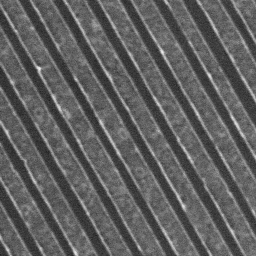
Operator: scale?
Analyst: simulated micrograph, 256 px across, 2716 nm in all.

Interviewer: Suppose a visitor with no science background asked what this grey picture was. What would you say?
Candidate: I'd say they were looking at parallel lines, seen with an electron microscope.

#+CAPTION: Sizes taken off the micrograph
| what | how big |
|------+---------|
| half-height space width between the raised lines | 172 nanometres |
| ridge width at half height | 12.5 px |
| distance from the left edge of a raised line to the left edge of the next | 0.306 micrometres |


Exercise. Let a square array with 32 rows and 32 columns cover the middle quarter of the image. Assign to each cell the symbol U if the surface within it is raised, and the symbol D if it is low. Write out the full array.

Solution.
UDDDDDUUUUDDDDDUUUDDDDDUUUUDDDDU
UUDDDDDUUUDDDDDUUUUDDDDUUUUDDDDD
UUDDDDDUUUUDDDDDUUUDDDDDUUUUDDDD
UUUDDDDDUUUUDDDDUUUUDDDDDUUUDDDD
UUUUDDDDUUUUDDDDDUUUDDDDDUUUUDDD
DUUUDDDDDUUUUDDDDUUUUDDDDDUUUDDD
DUUUUDDDDDUUUDDDDDUUUDDDDDUUUUDD
DDUUUDDDDDUUUUDDDDDUUUDDDDDUUUDD
DDDUUUDDDDDUUUDDUDDUUUUDDDDDUUUD
DDDUUUUDDDDUUUUDDDDDUUUDDDDDUUUU
DDDDUUUDDDDDUUUDDDDDUUUUDDDDDUUU
DDDDUUUUDDDDDUUUDDDDDUUUUDDDDUUU
UDDDDUUUUUDDDUUUUDDDDUUUUDDDDDUU
UDDDDUUUUUDDDDUUUDDDDDUUUUDDDDUU
UDDDDDUUUDDDDDUUUUDDDDDUUUDDDDDU
UUDDDDDUUUDDDDDUUUDDDDDUUUUDDDDD
UUDUDDDUUUDDDDUUUUUDDDDDUUUDUDDD
UUUDDDUUUUUDDDUUUUUDDDDDUUUUDDDD
UUUDDDDDUUUUDDDDDUUUDDDDDUUUUDDD
UUUUDDDDDUUUDDDDDUUUUDDDDUUUUDDD
DUUUDDDDDUUUUDDDDDUUUDDDDDUUUUDD
DDUUUDDDUDUUUDDDDDUUUUDDDDDUUUDD
DDUUUDDDDDDUUUDDDDDUUUDDDDDUUUUD
DDDUUUDDDDDUUUDDDDDUUUUDDDDDUUUU
DDDUUUUDDDDDUUUDDDDDUUUUDDDDUUUU
DDDDUUUDDDDDUUUUDDDDDUUUDDDDDUUU
DDDDDUUUDDDDDUUUDDUUDUUUUDUDDUUU
DDDDDUUUDDDDDUUUUDUUDDUUUDUDDDUU
UDDDDDUUUDDDDDUUUDDDDDUUUUDDDDDU
UDDDDDUUUUDDDDDUUUDDDDDUUUDDDDDU
UUDDDDDUUUDDDDDUUUDDDDDDUUUDDDDD
UUUDDDDUUUUDDDUUUUUDDDDDUUUUDDDD